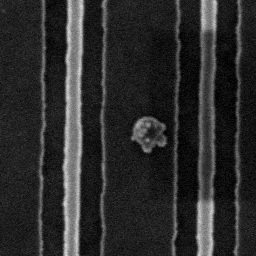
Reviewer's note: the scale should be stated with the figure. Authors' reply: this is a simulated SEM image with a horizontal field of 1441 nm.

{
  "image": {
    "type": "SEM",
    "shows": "lines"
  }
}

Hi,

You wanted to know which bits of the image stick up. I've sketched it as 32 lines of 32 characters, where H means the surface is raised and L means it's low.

HHHHHLLLLHLLLHHHHHHHHHLLLHHLLLHH
HHHHHLLLLHLLLHHHHHHHHHLLLHHLLLHH
HHHHHLLLLHLLLHHHHHHHHHLLLHHLLLHH
HHHHHLLLHHLLLHHHHHHHHHLLLHHLLLHH
HHHHHHLLHHLLLHHHHHHHHHLLLHHLLLHH
HHHHHLLLLHLLLHHHHHHHHHLLLHHLLLHH
HHHHHHLLHHLLLHHHHHHHHHLLLHHLLLHH
HHHHHLLLHHLLLHHHHHHHHHLLLHHLLLHH
HHHHHLLLHHLLLHHHHHHHHHLLLHHLLLHH
HHHHHLLLHHLLLHHHHHHHHHLLLHHLLLHH
HHHHHLLLHHLLLHHHHHHHHHLLLHHLLLHH
HHHHHLLLHHLLLHHHHHHHHHLLLHHLLLHH
HHHHHLLLHHLLLHHHHHHHHHLLLHHLLLHH
HHHHHLLLHHLLLHHHHHHHHHLLLHHLLLHH
HHHHHLLLHHLLLHHHHHHHHHLLLHHLLLHH
HHHHHHLLHHLLLHHHHHHHHHLLLHHLLLHH
HHHHHLLLHHLLLHHHHHHHHHLLLHHLLLHH
HHHHHLLLHHLLLHHHHHHHHHLLLHHLLLHH
HHHHHLLLHHLLLHHHHHHHHHLLLHHLLLHH
HHHHHLLLHHLLLHHHHHHHHHLLLHHLLLHH
HHHHHLLLHHLLLHHHHHHHHHLLLHHLLLHH
HHHHHLLLHHLLLHHHHHHHHHLLLHHLLLHH
HHHHHLLLHHLLLHHHHHHHHHLLLHHLLLHH
HHHHHLLLHHLLLHHHHHHHHHLLLHHLLHHH
HHHHHLLLHHLLLHHHHHHHHHLLLHHLLLHH
HHHHHLLLHHLLLHHHHHHHHHLLLHHLLLHH
HHHHHLLLHHLLLHHHHHHHHHLLLHHLLLHH
HHHHHLLLHHLLLHHHHHHHHHLLLHLLLLHH
HHHHHLLLHHLLLHHHHHHHHHLLLHLLLLHH
HHHHHLLLHHLLLHHHHHHHHHLLLHLLLLHH
HHHHHLLLHHLLLHHHHHHHHHLLLHHLLHHH
HHHHHLLLHHLLLHHHHHHHHHLLLHLLLHHH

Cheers